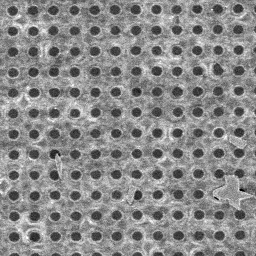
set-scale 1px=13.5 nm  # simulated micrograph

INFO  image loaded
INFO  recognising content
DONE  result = a regular array of holes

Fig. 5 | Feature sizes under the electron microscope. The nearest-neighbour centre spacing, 273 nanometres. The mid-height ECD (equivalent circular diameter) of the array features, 150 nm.